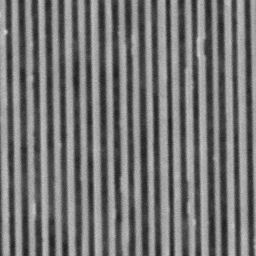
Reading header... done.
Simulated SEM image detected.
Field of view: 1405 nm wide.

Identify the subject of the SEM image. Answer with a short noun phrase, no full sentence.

parallel lines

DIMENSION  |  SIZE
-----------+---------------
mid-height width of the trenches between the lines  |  41.9 nm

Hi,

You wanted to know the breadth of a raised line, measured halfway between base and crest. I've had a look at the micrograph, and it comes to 31.6 nanometers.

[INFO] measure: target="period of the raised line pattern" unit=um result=0.073